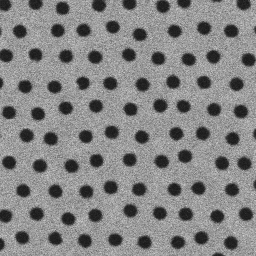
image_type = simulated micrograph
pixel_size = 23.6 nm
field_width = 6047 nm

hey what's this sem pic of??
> a regular array of holes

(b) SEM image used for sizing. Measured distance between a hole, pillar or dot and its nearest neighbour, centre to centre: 622 nanometres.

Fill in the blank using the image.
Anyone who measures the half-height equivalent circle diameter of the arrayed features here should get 328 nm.